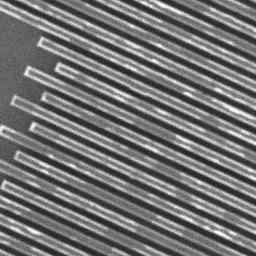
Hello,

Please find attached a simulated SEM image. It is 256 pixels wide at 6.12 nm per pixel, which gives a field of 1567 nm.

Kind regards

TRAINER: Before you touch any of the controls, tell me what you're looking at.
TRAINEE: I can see parallel lines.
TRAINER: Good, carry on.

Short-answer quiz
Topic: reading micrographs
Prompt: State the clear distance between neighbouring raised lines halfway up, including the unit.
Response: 7.04 pixels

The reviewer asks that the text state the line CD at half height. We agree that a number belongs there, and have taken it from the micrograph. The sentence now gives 8.76 px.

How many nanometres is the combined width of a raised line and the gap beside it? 99.3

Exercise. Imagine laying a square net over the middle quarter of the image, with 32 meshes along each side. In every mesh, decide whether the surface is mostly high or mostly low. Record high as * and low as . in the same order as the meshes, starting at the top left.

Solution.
*....*****.....*****....*****...
***....*****.....*****.....*****
*****....*****.....*****.....***
..*****.....*****....*****.....*
....*****.....*****....******...
**....*****.....*****.....*****.
****....******....*****.....****
.*****....******....*****.....**
...*****....******....*****.....
*....*****.....*****.....*****..
***....*****.....*****.....*****
*****.....*****....******....***
..*****.....*****....******....*
....******....*****....******...
**....******....*****.....*****.
****....******....*****.....****
.*****.....*****....*****.....**
...*****.....*****.....*****....
*....*****.....*****.....*****..
***.....*****....******....*****
*****.....*****....******....***
..******....*****....******....*
....******....*****.....*****...
**....******....*****.....*****.
****.....*****.....*****....****
.*****.....*****.....*****....**
....*****....*****.....*****....
*.....*****....******....*****..
***.....*****....******....*****
******....*****....******....***
..******....*****.....*****.....
....******....*****.....*****...